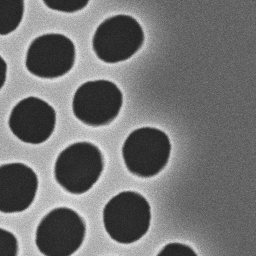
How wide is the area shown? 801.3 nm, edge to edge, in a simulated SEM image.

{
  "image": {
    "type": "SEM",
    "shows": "holes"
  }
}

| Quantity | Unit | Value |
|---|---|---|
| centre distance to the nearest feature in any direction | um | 0.207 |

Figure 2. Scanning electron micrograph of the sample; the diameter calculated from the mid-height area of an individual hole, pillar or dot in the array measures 0.154 µm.